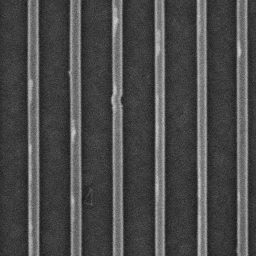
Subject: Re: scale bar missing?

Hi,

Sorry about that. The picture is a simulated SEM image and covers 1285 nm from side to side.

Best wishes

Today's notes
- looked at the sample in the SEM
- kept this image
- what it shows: parallel lines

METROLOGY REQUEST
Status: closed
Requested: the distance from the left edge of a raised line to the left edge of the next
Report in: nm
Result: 210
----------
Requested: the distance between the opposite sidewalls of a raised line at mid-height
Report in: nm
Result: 47.7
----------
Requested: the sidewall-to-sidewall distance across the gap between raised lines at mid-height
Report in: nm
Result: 166